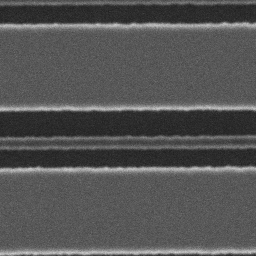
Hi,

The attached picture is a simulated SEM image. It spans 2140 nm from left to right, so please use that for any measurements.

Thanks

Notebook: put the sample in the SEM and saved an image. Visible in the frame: lines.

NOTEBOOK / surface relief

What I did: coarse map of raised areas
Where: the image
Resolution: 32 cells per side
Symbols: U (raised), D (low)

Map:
UUUDDUUUDUDDDDDDDDDDDDDDDDDDDDDD
DDDDDDDDDDDDDDDDDDDDDDDDDDDDDDDD
DDDDDDDDDDDDDDDDDDDDDDDDDDDDDDDD
UUUUUUUUUUUUUUUUUUUUUUUUUUUUUUUU
UUUUUUUUUUUUUUUUUUUUUUUUUUUUUUUU
UUUUUUUUUUUUUUUUUUUUUUUUUUUUUUUU
UUUUUUUUUUUUUUUUUUUUUUUUUUUUUUUU
UUUUUUUUUUUUUUUUUUUUUUUUUUUUUUUU
UUUUUUUUUUUUUUUUUUUUUUUUUUUUUUUU
UUUUUUUUUUUUUUUUUUUUUUUUUUUUUUUU
UUUUUUUUUUUUUUUUUUUUUUUUUUUUUUUU
UUUUUUUUUUUUUUUUUUUUUUUUUUUUUUUU
UUUUUUUUUUUUUUUUUUUUUUUUUUUUUUUU
UUUUUUUUUUUUUUUUUUUUUUUUUUUUUUUU
DDDDDDDDDDDDDDDDDDDDDDDDDDDDDDDD
DDDDDDDDDDDDDDDDDDDDDDDDDDDDDDDD
DDDDDDDDDDDDDDDDDDDDDDDDDDDDDDDD
UUUUUUUUUUUUUUUUUUUUUUUUUUUUUUUU
UUUUUUUUUUUUDUDDUUUUDDDUUDDDDDDD
DDDDDDDDDDDDDDDDDDDDDDDDDDDDDDDD
DDDDDDDDDDDDDDDDDDDDDDDDDDDDDDDD
UUUUUUUUUUUUUUUUUUUUUUUUUUUUUUUU
UUUUUUUUUUUUUUUUUUUUUUUUUUUUUUUU
UUUUUUUUUUUUUUUUUUUUUUUUUUUUUUUU
UUUUUUUUUUUUUUUUUUUUUUUUUUUUUUUU
UUUUUUUUUUUUUUUUUUUUUUUUUUUUUUUU
UUUUUUUUUUUUUUUUUUUUUUUUUUUUUUUU
UUUUUUUUUUUUUUUUUUUUUUUUUUUUUUUU
UUUUUUUUUUUUUUUUUUUUUUUUUUUUUUUU
UUUUUUUUUUUUUUUUUUUUUUUUUUUUUUUU
UUUUUUUUUUUUUUUUUUUUUUUUUUUUUUUU
UUUUUUUUUUUUUUUUUUUUUUUUUUUUUUUU